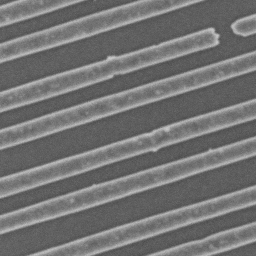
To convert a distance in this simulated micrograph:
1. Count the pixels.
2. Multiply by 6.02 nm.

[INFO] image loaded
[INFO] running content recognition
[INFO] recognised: parallel lines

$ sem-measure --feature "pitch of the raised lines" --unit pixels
40.9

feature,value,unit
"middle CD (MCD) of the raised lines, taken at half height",109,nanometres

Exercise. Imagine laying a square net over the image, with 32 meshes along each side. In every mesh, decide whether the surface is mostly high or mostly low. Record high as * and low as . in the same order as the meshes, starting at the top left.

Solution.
.********.......********........
******.......********...........
***......*********............**
......********...............***
...********............****.....
********............*******.....
****.............*******........
*............********.......****
..........********.......*******
.......*******........********..
...********........*******......
*********.......*******.........
*****.......********............
**.......********...........****
.....********............*******
...*******............********..
*******............*******......
****............*******........*
............********.......*****
.........*******........********
......*******........*******....
...*******........*******.......
*******.......********..........
****.......********............*
*.......********............****
.....*******............********
..*******............*******....
******............*******.......
**............********.......***
...........********.......******
........********.......********.
.....********.......********....